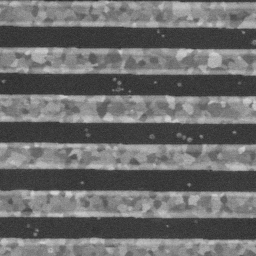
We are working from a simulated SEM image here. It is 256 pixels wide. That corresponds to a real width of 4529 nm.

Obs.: lines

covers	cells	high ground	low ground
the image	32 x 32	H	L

HHHHHHHHHHHHHHHHHHHHHHHHHHHHHHHH
HHHHHHHHHHHHHHHHHHHHHHHHHHHHHHHH
HHHHHHHHHHHHHHHHHHHHHHHHHHHHHHHH
LLLLLLLLLLLLLLLLLLLLLLLLLLLLLLLL
LLLLLLLLLLLLLLLLLLLLLLLLLLLLLLLL
LLLLLLLLLLLLLLLLLLLLLLLLLLLLLLLL
HHHHHHHHHHHHHHHHHHHHHHHHHHHHHHHH
HHHHHHHHHHHHHHHHHHHHHHHHHHHHHHHH
HHHHHHHHHHHHHHHHHHHHHHHHHHHHHHHH
LLLLLLLLLLLLLLLLLLLLLLLLLLLLLLLL
LLLLLLLLLLLLLLLLLLLLLLLLLLLLLLLL
LLLLLLLLLLLLLLLLLLLLLLLLLLLLLLLL
HHHHHHHHHHHHHHHHHHHHHHHHHHHHHHHH
HHHHHHHHHHHHHHHHHHHHHHHHHHHHHHHH
HHHHHHHHHHHHHHHHHHHHHHHHHHHHHHHH
LLLLLLLLLLLLLLLLLLLLLLLLLLLLLLLL
LLLLLLLLLLLLLLLLLLLLLLLLLLLLLLLL
LLLLLLLLLLLLLLLLLLLLLLLLLLLLLLLL
HHHHHHHHHHHHHHHHHHHHHHHHHHHHHHHH
HHHHHHHHHHHHHHHHHHHHHHHHHHHHHHHH
HHHHHHHHHHHHHHHHHHHHHHHHHHHHHHHH
LLLLLLLLLLLLLLLLLLLLLLLLLLLLLLLL
LLLLLLLLLLLLLLLLLLLLLLLLLLLLLLLL
LLLLLLLLLLLLLLLLLLLLLLLLLLLLLLLL
HHHHHHHHHHHHHHHHHHHHHHHHHHHHHHHH
HHHHHHHHHHHHHHHHHHHHHHHHHHHHHHHH
HHHHHHHHHHHHHHHHHHHHHHHHHHHHHHHH
LLLLLLLLLLLLLLLLLLLLLLLLLLLLLLLL
LLLLLLLLLLLLLLLLLLLLLLLLLLLLLLLL
LLLLLLLLLLLLLLLLLLLLLLLLLLLLLLLL
HHHHHHHHHHHHHHHHHHHHHHHHHHHHHHHH
HHHHHHHHHHHHHHHHHHHHHHHHHHHHHHHH